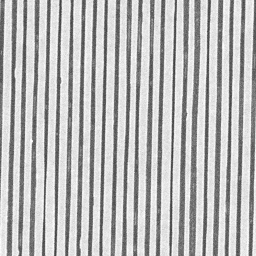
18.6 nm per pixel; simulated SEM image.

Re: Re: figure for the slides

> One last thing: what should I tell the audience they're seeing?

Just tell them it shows parallel lines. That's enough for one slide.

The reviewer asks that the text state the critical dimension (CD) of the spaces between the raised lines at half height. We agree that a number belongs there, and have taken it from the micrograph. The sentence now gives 88.4 nanometres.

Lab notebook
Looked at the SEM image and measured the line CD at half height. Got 0.126 microns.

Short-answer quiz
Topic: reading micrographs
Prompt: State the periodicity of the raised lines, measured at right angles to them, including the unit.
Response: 214 nanometers